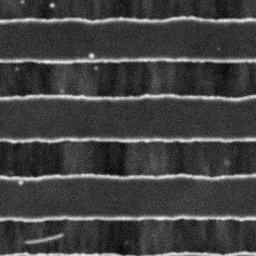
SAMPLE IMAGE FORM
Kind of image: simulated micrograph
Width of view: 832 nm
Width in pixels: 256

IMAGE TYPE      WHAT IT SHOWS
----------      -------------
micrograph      lines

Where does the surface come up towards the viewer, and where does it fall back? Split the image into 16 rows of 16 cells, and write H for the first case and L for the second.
LLLLLLLLLLLLLLLL
HHHHHHHHHHHHHHHH
HHHHHHHHHHHHHHHH
HHHHHHHHHHHHHHHH
LLLLLLLLLLLLLLLL
LLLLLLLLLLLLLLLL
HHHHHHHHHHHHHHHH
HHHHHHHHHHHHHHHH
HHHHHHHHHHHHHHHH
LLLLLLLLLLLLLLLL
LLLLLLLLLLLLLLLL
HHHHHHHHHHHHHHHH
HHHHHHHHHHHHHHHH
HHHHHHHHHHHHHHHH
LLLLLLLLLLLLLLLL
LLLLLLLLLLLLLLLL